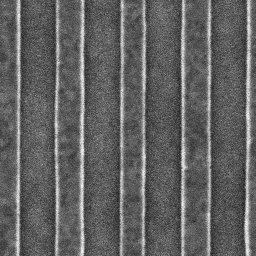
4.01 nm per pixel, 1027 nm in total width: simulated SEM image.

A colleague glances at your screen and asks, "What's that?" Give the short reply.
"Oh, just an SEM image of one or a few lines or trenches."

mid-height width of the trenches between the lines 155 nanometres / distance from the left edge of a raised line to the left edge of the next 0.254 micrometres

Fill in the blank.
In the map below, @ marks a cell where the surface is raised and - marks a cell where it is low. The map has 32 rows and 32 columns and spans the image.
@@-----@@@-----@@@-----@@@-----@
@@-----@@@-----@@@-----@@@-----@
@@-----@@@-----@@@-----@@@-----@
@@-----@@@-----@@@-----@@@-----@
@@-----@@@-----@@@-----@@@-----@
@@-----@@@-----@@@-----@@@-----@
@@-----@@@-----@@@-----@@@-----@
@@-----@@@-----@@@-----@@@-----@
@@-----@@@-----@@@-----@@@-----@
@@-----@@@-----@@@-----@@@-----@
@@-----@@@-----@@@-----@@@-----@
@@-----@@@-----@@@-----@@@-----@
@@-----@@@-----@@@-----@@@-----@
@@-----@@@-----@@@-----@@@-----@
@@-----@@@-----@@@-----@@@-----@
@@-----@@@-----@@@-----@@@-----@
@@-----@@@-----@@@-----@@@-----@
@@-----@@@-----@@@-----@@@-----@
@@-----@@@-----@@@-----@@@-----@
@@-----@@@-----@@@-----@@@-----@
@@-----@@@-----@@@-----@@@-----@
@@-----@@@-----@@@-----@@@-----@
@@-----@@@-----@@@-----@@@-----@
@@-----@@@-----@@@-----@@@-----@
@@-----@@@-----@@@-----@@@-----@
@@-----@@@-----@@@-----@@@-----@
@@-----@@@-----@@@-----@@@-----@
@@-----@@@-----@@@-----@@@-----@
@@-----@@@-----@@@-----@@@-----@
@@-----@@@-----@@@-----@@@-----@
@@-----@@@-----@@@-----@@@-----@
@@-----@@@-----@@@-----@@@-----@